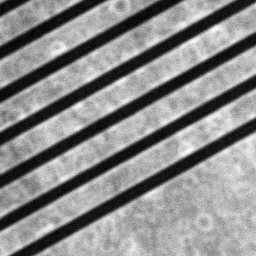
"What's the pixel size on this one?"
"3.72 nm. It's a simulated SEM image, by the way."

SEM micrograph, parallel lines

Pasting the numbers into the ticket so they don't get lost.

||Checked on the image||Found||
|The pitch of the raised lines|139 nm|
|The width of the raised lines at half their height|88.2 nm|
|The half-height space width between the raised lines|49.2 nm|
